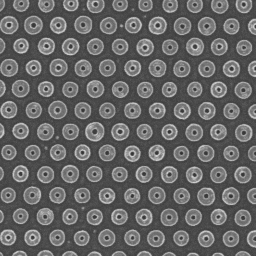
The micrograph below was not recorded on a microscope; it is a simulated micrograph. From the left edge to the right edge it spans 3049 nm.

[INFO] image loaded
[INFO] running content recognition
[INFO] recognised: a regular array of ring-shaped raised bodies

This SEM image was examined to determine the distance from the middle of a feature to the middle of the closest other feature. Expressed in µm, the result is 0.286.